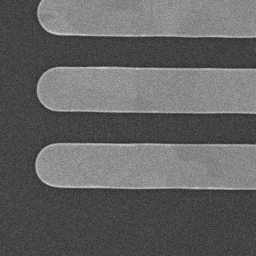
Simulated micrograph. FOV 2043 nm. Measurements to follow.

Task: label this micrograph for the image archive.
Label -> groups of lines, slits or small figures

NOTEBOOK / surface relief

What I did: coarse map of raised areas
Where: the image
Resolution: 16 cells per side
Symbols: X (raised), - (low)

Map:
--XXXXXXXXXXXXXX
---XXXXXXXXXXXXX
----------------
----------------
---XXXXXXXXXXXXX
--XXXXXXXXXXXXXX
---XXXXXXXXXXXXX
----------------
----------------
---XXXXXXXXXXXXX
--XXXXXXXXXXXXXX
---XXXXXXXXXXXXX
----------------
----------------
----------------
----------------